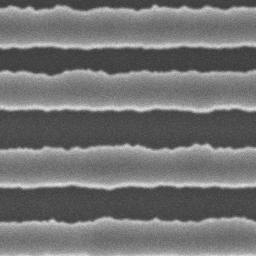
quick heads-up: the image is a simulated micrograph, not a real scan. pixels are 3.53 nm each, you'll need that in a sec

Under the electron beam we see lines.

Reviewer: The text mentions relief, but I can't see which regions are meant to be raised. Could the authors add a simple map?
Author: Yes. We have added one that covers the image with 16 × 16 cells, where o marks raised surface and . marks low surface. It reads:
o..o.....ooo...o
oooooooooooooooo
oooooooooooooooo
................
....oo..........
oooooooooooooooo
oooooooooooooooo
................
................
oooooooooooooooo
oooooooooooooooo
oooooooooooooooo
................
................
oooooooooooooooo
oooooooooooooooo